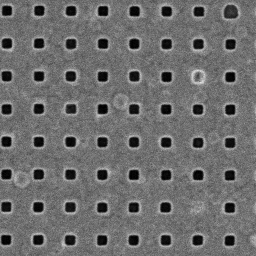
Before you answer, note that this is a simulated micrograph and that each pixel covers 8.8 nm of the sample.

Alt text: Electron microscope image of a regular array of holes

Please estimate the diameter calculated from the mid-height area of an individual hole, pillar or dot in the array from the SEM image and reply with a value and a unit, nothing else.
102 nanometres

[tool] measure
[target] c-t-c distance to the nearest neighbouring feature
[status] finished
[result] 278 nanometres